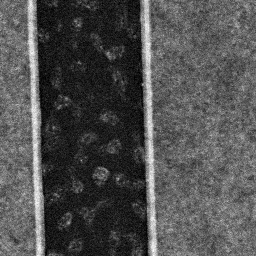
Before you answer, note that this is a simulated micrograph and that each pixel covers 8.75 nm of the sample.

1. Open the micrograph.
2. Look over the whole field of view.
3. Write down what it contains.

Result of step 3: one or a few lines or trenches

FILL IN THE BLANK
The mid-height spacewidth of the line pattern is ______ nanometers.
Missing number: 1010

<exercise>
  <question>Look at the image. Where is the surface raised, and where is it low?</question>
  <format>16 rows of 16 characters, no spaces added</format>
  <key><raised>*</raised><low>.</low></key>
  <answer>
**.......*******
**.......*******
**.......*******
**.......*******
**.......*******
**.......*******
**.......*******
**.......*******
**.......*******
**.......*******
**.......*******
**........******
**........******
**........******
**........******
**........******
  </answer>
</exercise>